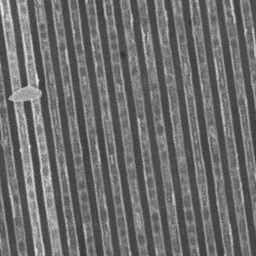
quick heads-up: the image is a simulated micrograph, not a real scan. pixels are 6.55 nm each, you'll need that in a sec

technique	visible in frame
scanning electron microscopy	parallel lines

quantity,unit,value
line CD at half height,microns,0.0576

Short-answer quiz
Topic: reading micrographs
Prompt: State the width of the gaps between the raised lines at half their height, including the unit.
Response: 51.8 nm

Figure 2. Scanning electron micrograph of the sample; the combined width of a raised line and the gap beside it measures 111 nm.